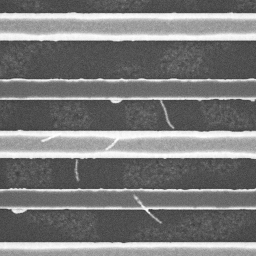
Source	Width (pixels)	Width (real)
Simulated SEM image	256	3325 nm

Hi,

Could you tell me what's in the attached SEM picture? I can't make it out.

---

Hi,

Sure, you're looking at lines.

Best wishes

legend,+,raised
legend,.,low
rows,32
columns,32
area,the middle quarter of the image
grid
................................
................................
................................
................................
++++++++++++++++++++++++++++++++
++++++++++++++++++++++++++++++++
++++++++++++++++++++++++++++++++
++++++++++++++++++++++++++++++++
++++++++++++++++++++++++++++++++
................................
................................
................................
................................
................................
................................
................................
................................
+...++++...................+....
++++++++++++++++++++++++++++++++
++++++++++++++++++++++++++++++++
++++++++++++++++++++++++++++++++
++++++++++++++++++++++++++++++++
++++++++++++++++++++++++++++++++
................................
................................
................................
................................
................................
................................
................................
................................
++++++++++++++++++++++++++++++.+